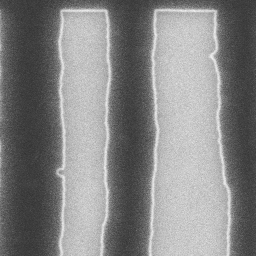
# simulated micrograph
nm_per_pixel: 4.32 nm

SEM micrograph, one or a few lines or trenches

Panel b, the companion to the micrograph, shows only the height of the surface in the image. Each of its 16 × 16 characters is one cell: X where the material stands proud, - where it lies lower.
XXXXXXXXXXXXXXXX
XXXX---XXX---XXX
XXXX---XXX---XXX
XXXX---XXX---XXX
XXXX---XXX----XX
XXXX---XXX----XX
XXXX---XXX----XX
XXXX---XXX----XX
XXXX---XXX----XX
XXXX---XXX----XX
XXXX---XXX----XX
XXXX---XXX----XX
XXXX---XXX----XX
XXXX---XXX----XX
XXXX--XXX-----XX
XXXX--XXX-----XX